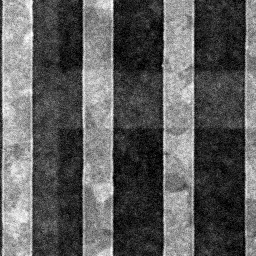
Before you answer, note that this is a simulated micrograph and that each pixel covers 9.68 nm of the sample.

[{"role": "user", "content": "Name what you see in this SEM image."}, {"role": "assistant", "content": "one or a few lines or trenches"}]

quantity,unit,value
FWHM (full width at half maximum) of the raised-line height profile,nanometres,274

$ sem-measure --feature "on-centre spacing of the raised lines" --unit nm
782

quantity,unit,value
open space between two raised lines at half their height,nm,510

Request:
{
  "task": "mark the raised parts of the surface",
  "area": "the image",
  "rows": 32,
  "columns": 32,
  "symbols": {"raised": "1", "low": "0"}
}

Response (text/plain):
11110000001111000000011100000001
11110000001111000000011100000001
11110000001111000000011100000001
11110000001111000000011100000001
11110000001111000000011100000001
11110000001111000000011100000001
11110000000111000000011100000001
11110000001111000000111100000001
11110000001111000000111100000001
11110000001111000000011100000001
11110000001111000000011100000001
11110000001111000000011100000001
11110000001111000000011100000001
11110000001111000000011100000001
11110000001111000000011100000001
11110000001111000000011100000001
11110000000111000000011100000001
11110000000111000000011100000001
11110000000111000000011100000001
11110000000111000000011100000001
11110000000111000000011100000001
11110000000111000000011100000001
11110000001111000000011100000001
11110000001111000000011100000001
11110000001111000000011100000001
11110000001111000000011100000001
11110000001111000000011100000001
11110000000111000000011100000001
11110000000111000000011100000001
11110000000111000000011100000001
11110000000111000000011100000001
11110000000111000000011100000001